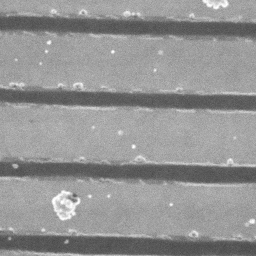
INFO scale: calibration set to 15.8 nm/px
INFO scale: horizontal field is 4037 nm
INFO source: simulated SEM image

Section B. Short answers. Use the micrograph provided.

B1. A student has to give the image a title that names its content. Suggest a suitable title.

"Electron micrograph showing lines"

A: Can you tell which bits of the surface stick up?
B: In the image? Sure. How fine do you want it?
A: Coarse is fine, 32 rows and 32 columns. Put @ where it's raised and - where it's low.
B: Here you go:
--------------------------@@----
--------------------------------
@@@@@@@@@@@@@@@@@@@@@@@@--------
@@@@@@@@@@@@@@@@@@@@@@@@@@@@@@@@
----------------@@@@@@@@@@@@@@@@
--------------------------------
--------------------------------
--------------------------------
--------------------------------
--------------------------------
--------------------------------
@@@@@@@@@@@@@@@@@@@@@@----------
@@@@@@@@@@@@@@@@@@@@@@@@@@@@@@@@
-----------@@@@@@@@@@@@@@@@@@@@@
--------------------------------
--------------------------------
--------------------------------
--------------------------------
--------------------------------
--------------------------------
@@@@@@@@@@@@@@@@@@@@@@@@----@---
@@@@@@@@@@@@@@@@@@@@@@@@@@@@@@@@
-------------@@@@@@@@@@@@@@@@@@@
--------------------------------
-------@@-----------------------
-------@@@----------------------
-------@@-----------------------
--------------------------------
--------------------------------
@@@@@@@@@@@@@@@-----------------
@@@@@@@@@@@@@@@@@@@@@@@@@@@@@@@@
--@@@@@@@@@@@@@@@@@@@@@@@@@@@@@@